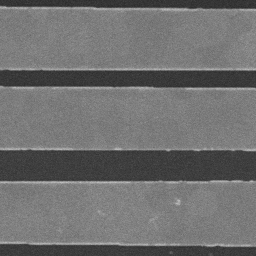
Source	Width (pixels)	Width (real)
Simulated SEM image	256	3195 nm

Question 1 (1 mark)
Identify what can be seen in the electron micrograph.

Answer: lines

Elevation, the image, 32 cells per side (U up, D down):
DDDDDDDDDDDDDDDDDDDDDDDDDDDDDDDD
UUUUUUUUUUUUUUUUUUUUUUUUUUUUUUUU
UUUUUUUUUUUUUUUUUUUUUUUUUUUUUUUU
UUUUUUUUUUUUUUUUUUUUUUUUUUUUUUUU
UUUUUUUUUUUUUUUUUUUUUUUUUUUUUUUU
UUUUUUUUUUUUUUUUUUUUUUUUUUUUUUUU
UUUUUUUUUUUUUUUUUUUUUUUUUUUUUUUU
UUUUUUUUUUUUUUUUUUUUUUUUUUUUUUUU
UUUUUUUUUUUUUUUUUUUUUUUUUUUUUUUU
DDDDDDDDDDDDDDDDDDDDDDDDDDDDDDDD
DDDDDDDDDDDDDDDDDDDDDDDDDDDDDDDD
UUUUUUUUUUUUUUUUUUUUUUUUUUUUUUUU
UUUUUUUUUUUUUUUUUUUUUUUUUUUUUUUU
UUUUUUUUUUUUUUUUUUUUUUUUUUUUUUUU
UUUUUUUUUUUUUUUUUUUUUUUUUUUUUUUU
UUUUUUUUUUUUUUUUUUUUUUUUUUUUUUUU
UUUUUUUUUUUUUUUUUUUUUUUUUUUUUUUU
UUUUUUUUUUUUUUUUUUUUUUUUUUUUUUUU
UUUUUUUUUUUUUUUUUUUUUUUUUUUUUUUU
DDDDDDDDDDDDDDDDDDDDDDDDDDDDDDDD
DDDDDDDDDDDDDDDDDDDDDDDDDDDDDDDD
DDDDDDDDDDDDDDDDDDDDDDDDDDDDDDDD
DDDDDDDDDDDDDDDDDDDDDDDDDDDDDDDD
UUUUUUUUUUUUUUUUUUUUUUUUUUUUUUUU
UUUUUUUUUUUUUUUUUUUUUUUUUUUUUUUU
UUUUUUUUUUUUUUUUUUUUUUUUUUUUUUUU
UUUUUUUUUUUUUUUUUUUUUUUUUUUUUUUU
UUUUUUUUUUUUUUUUUUUUUUUUUUUUUUUU
UUUUUUUUUUUUUUUUUUUUUUUUUUUUUUUU
UUUUUUUUUUUUUUUUUUUUUUUUUUUUUUUU
DDDUUUUUUUUUUUUUUUUUUUUUUUUUUUUU
DDDDDDDDDDDDDDDDDDDDDDDDDDDDDDDD